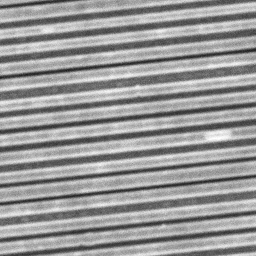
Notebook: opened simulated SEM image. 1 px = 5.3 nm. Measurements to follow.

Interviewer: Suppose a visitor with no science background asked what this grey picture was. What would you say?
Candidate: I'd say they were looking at parallel lines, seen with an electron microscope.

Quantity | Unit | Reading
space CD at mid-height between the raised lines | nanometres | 40.1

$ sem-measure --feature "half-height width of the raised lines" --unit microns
0.054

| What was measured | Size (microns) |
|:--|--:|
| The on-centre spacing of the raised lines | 0.094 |